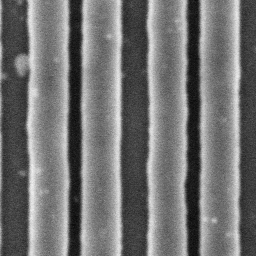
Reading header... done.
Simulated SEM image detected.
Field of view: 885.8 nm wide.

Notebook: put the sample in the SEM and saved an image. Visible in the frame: lines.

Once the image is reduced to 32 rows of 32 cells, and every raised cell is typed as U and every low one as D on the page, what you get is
DDDDUUUUDDUUUUUDDDDUUUUDDUUUUUDD
DDDDUUUUDDUUUUUDDDDUUUUDDUUUUUDD
DDDDUUUUDDUUUUUDDDDUUUUDDUUUUUDD
DDDDUUUUUDUUUUUDDDUUUUUDDUUUUUDD
DDDDUUUUDDUUUUUDDDDUUUUDDUUUUUDD
DDDDUUUUDDUUUUUDDDDUUUUDDUUUUUDD
DDDDUUUUDDUUUUUDDDDUUUUDDUUUUUDD
DDDDUUUUDDUUUUUDDDDUUUUDDUUUUUDD
DDDDUUUUUDUUUUUDDDDUUUUDDUUUUUDD
DDDDUUUUDDUUUUUDDDDUUUUDDUUUUUDD
DDDDUUUUDDUUUUUDDDDUUUUDDUUUUUDD
DDDDUUUUDDUUUUUDDDDUUUUDDUUUUUDD
DDDDUUUUDDUUUUUDDDDUUUUDDUUUUUDD
DDDDUUUUDDUUUUUDDDDUUUUDDUUUUUDD
DDDDUUUUDDUUUUUDDDDUUUUDDUUUUUDD
DDDUUUUUDDUUUUUDDDDUUUUDDUUUUUDD
DDDDUUUUDDUUUUUDDDDUUUUDDUUUUUDD
DDDDUUUUDDUUUUUDDDDUUUUDDUUUUUDD
DDDDUUUUDDUUUUUDDDDUUUUDDUUUUUDD
DDDDUUUUDDUUUUUDDDDUUUUDDUUUUUDD
DDDDUUUUDDUUUUUDDDDUUUUDDUUUUUDD
DDDDUUUUDDUUUUUDDDDUUUUDDUUUUUDD
DDDDUUUUUDUUUUUDDDDUUUUDDUUUUUDD
DDDDUUUUUDUUUUUDDDDUUUUDDUUUUUDD
DDDDUUUUDDUUUUUDDDDUUUUDDUUUUUDD
DDDDUUUUDDUUUUUDDDDUUUUDDUUUUUDD
DDDDUUUUDDUUUUUDDDDUUUUDDUUUUUDD
DDDDUUUUDDUUUUUDDDDUUUUDDUUUUUDD
DDDDUUUUDDUUUUUDDDDUUUUDDUUUUUDD
DDDDUUUUDDUUUUUDDDDUUUUDDUUUUUDD
DDDDUUUUDDUUUUUDDDDUUUUDDUUUUUDD
DDDDUUUUDDUUUUUDDDDUUUUDDUUUUUDD